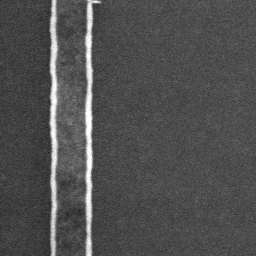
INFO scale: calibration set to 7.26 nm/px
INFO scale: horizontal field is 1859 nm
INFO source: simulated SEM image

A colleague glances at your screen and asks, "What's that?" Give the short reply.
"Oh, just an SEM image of one or a few lines or trenches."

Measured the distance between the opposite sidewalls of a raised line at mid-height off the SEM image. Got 36.4 px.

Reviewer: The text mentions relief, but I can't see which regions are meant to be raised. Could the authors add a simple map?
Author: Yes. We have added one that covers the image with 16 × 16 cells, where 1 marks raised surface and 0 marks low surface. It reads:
0001110000000000
0001110000000000
0001110000000000
0001110000000000
0001110000000000
0001110000000000
0001110000000000
0001110000000000
0001110000000000
0001110000000000
0001110000000000
0001110000000000
0001110000000000
0001110000000000
0001110000000000
0001110000000000